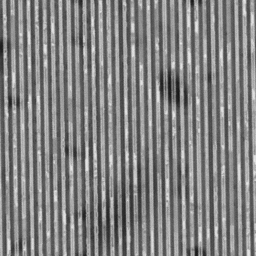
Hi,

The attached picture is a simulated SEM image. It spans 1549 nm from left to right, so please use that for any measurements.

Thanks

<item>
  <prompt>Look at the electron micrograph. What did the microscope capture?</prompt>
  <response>parallel lines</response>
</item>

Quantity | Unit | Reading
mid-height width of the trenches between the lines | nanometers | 26.5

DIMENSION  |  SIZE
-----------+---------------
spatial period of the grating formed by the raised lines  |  48.4 nanometres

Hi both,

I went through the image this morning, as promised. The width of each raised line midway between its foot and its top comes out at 3.5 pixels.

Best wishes